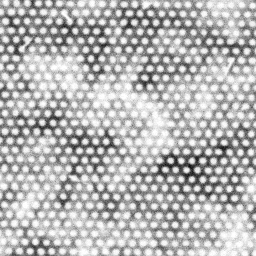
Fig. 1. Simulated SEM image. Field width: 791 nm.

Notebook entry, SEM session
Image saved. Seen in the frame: a regular array of raised bodies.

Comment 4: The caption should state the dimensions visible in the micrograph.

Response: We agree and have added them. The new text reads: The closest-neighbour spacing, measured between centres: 31.8 nm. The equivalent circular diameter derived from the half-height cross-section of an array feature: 17.4 nm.